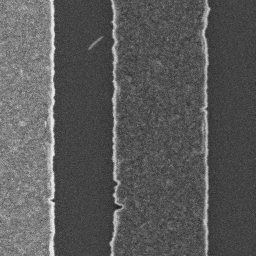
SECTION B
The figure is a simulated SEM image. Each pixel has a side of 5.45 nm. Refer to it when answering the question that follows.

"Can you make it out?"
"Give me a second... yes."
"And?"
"one or a few lines or trenches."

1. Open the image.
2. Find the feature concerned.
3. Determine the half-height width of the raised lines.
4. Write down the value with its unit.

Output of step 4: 503 nm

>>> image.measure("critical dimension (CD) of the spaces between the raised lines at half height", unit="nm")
336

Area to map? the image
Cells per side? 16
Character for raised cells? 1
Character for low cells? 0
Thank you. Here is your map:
1110000111111000
1110000111111000
1110000111111000
1110000111111000
1110000111111000
1110000111111000
1110000111111000
1110000111111000
1110000111111000
1110000111111000
1110000111111000
1110000111111000
1110000111111000
1110000111111000
1110000111111000
1110000111111000